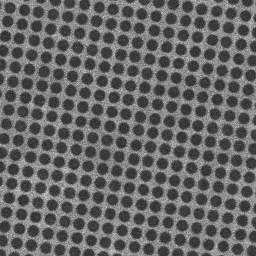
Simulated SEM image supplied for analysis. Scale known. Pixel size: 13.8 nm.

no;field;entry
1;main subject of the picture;a regular array of holes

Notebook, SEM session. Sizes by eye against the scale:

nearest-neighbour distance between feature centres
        0.196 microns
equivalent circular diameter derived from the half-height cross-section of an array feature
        162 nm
